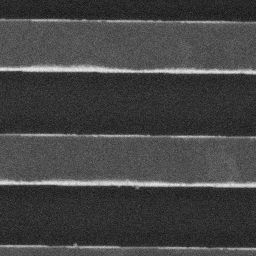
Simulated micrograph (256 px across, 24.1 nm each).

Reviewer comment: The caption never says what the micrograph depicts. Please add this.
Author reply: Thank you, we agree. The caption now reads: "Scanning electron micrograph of lines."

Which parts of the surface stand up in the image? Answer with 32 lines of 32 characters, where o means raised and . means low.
................................
................................
................................
oooooooooooooooooooooooooooooooo
oooooooooooooooooooooooooooooooo
oooooooooooooooooooooooooooooooo
oooooooooooooooooooooooooooooooo
oooooooooooooooooooooooooooooooo
oooooooooooooooooooooooooooooooo
................................
................................
................................
................................
................................
................................
................................
................................
oooooooooooooooooooooooooooooooo
oooooooooooooooooooooooooooooooo
oooooooooooooooooooooooooooooooo
oooooooooooooooooooooooooooooooo
oooooooooooooooooooooooooooooooo
oooooooooooooooooooooooooooooooo
................................
................................
................................
................................
................................
................................
................................
................................
oooooooooooooooooooooooooooooooo